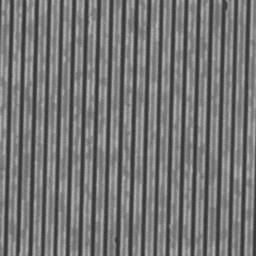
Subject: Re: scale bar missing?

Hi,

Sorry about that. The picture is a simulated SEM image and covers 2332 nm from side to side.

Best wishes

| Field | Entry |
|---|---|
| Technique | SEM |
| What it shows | parallel lines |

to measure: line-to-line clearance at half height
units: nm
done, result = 48.9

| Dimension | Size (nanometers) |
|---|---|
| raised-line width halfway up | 64.9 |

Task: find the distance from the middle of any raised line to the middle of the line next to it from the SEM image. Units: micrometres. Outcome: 0.113